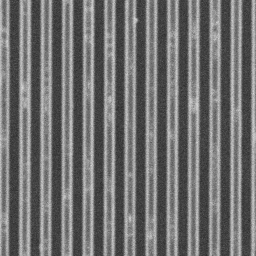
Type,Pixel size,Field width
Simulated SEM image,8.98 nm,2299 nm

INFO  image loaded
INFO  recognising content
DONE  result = parallel lines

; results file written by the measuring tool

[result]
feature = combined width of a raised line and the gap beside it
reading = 21.1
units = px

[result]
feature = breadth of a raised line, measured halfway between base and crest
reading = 83.1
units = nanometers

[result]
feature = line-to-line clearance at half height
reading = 108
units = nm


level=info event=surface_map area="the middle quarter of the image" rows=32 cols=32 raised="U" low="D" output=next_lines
UUDDDUUDDDUUDDDUUUDDDUUDDDUUDDDU
UUDDDUUDDDUUDDDUUUDDDUUDDDUUDDDU
UUDDDUUDDDUUDDDUUUDDDUUDDDUUDDDU
UUDDDUUDDDUUDDDUUUDDDUUDDDUUDDDU
UUDDDUUDDDUUDDDUUUDDDUUDDDUUDDDU
UUDDDUUDDDUUDDDUUUDDDUUDDDUUDDDU
UUDDDUUDDDUUDDDUUUDDDUUDDDUUDDDU
UUDDDUUDDDUUDDDUUUDDDUUDDDUUDDDU
UUDDDUUDDDUUDDDUUUDDDUUDDDUUDDDU
UUDDDUUDDDUUDDDUUUDDDUUDDDUUDDDU
UUDDDUUDDDUUDDDUUUDDDUUDDDUUDDDU
UUDDDUUDDDUUDDDUUUDDDUUDDDUUDDDU
UUDDDUUDDDUUDDDUUUDDDUUDDDUUDDDU
UUDDDUUDDDUUDDDUUUDDDUUDDDUUDDDU
UUDDDUUDDDUUDDDUUUDDDUUDDDUUDDDU
UUDDDUUDDDUUDDDUUUDDDUUDDDUUDDDU
UUDDDUUDDDUUDDDUUUDDDUUDDDUUDDDU
UUDDDUUDDDUUDDDUUUDDDUUDDDUUDDDU
UUDDDUUDDDUUDDDUUUDDDUUDDDUUDDDU
UUDDDUUDDDUUDDDUUUDDDUUDDDUUDDDU
UUDDDUUDDDUUDDDUUUDDDUUDDDUUDDDU
UUDDDUUDDDUUDDDUUUDDDUUDDDUUDDDU
UUDDDUUDDDUUDDDUUUDDDUUDDDUUDDDU
UUDDDUUDDDUUDDDUUUDDDUUDDDUUDDDU
UUDDDUUDDDUUDDDUUUDDDUUDDDUUDDDU
UUDDDUUDDDUUDDDUUUDDDUUDDDUUDDDU
UUDDDUUDDDUUDDDUUUDDDUUDDDUUDDDU
UUDDDUUDDDUUDDDUUUDDDUUDDDUUDDDU
UUDDDUUDDDUUDDDUUUDDDUUDDDUUDDDU
UUDDDUUDDDUUDDDUUUDDDUUDDDUUDDDU
UUDDDUUDDDUUDDDUUUDDDUUDDDUUDDDU
UUDDDUUDDDUUDDDUUUDDDUUDDDUUDDDU